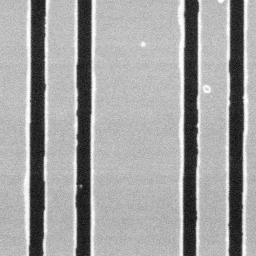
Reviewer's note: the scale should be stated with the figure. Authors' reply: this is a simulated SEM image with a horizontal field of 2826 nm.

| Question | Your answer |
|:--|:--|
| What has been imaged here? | lines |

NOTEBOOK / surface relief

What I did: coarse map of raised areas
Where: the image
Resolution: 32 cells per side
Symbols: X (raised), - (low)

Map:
XXXX--XXXX--XXXXXXXXXXX--XXXX--X
XXXX--XXXX--XXXXXXXXXXX--XXXX--X
XXXX--XXXX--XXXXXXXXXXX--XXXX--X
XXXX--XXXX--XXXXXXXXXXX--XXXX--X
XXXX--XXXX--XXXXXXXXXXX--XXXX--X
XXXX--XXXX--XXXXXXXXXXX--XXXX--X
XXXX--XXXX--XXXXXXXXXXX--XXXX--X
XXXX--XXX---XXXXXXXXXXX--XXXX--X
XXXX--XXX---XXXXXXXXXXX--XXXX--X
XXXX--XXX---XXXXXXXXXXX--XXXX--X
XXXX--XXX---XXXXXXXXXXX--XXXX--X
XXXX--XXX---XXXXXXXXXXX--XXXX--X
XXXX--XXX---XXXXXXXXXXX--XXXX--X
XXXX--XXX---XXXXXXXXXXX--XXXX--X
XXXX--XXX---XXXXXXXXXXX--XXXX--X
XXXX--XXXX--XXXXXXXXXXX--XXXX--X
XXXX--XXXX--XXXXXXXXXXX--XXXX--X
XXXX--XXX---XXXXXXXXXXX--XXXX--X
XXXX--XXX---XXXXXXXXXXX--XXXX--X
XXXX--XXX--XXXXXXXXXXXX--XXXX--X
XXXX--XXX--XXXXXXXXXXXX--XXXX--X
XXXX--XXX---XXXXXXXXXXX--XXXX--X
XXX---XXX---XXXXXXXXXXX--XXXX--X
XXX---XXX--XXXXXXXXXXXX--XXXX--X
XXX---XXX--XXXXXXXXXXXX--XXXX-XX
XXX---XXX---XXXXXXXXXXX--XXXX-XX
XXX---XXX---XXXXXXXXXXX--XXXX-XX
XXX---XXX---XXXXXXXXXXX--XXXX-XX
XXX---XXX---XXXXXXXXXXX--XXXX-XX
XXXX--XXX---XXXXXXXXXXX--XXXX-XX
XXXX-XXXX---XXXXXXXXXXX--XXXX-XX
XXXX--XXX---XXXXXXXXXXX--XXX--XX